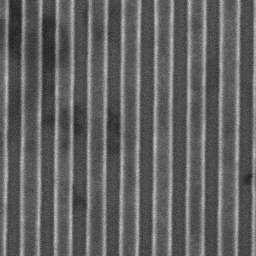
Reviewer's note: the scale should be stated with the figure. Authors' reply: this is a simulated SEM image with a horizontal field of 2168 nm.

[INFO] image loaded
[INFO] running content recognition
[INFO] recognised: wiring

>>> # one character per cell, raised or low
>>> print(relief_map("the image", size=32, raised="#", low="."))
#..##..##..##..###.###..##..##..
#..##..##..##..###.###..##..##..
#..##..##..##..##..###..##..##..
#..##..##..##..##..###..##..##..
#..##..##..##..##..###..##..##..
#..##..##..##..##..###..##..##..
#..##..##..##..##..###..##..##..
#..##..##..##..##..###..##..##..
#..##..##..##..##..###..##..##..
#..##..##..##..##..###..##..##..
#..##..##..##..##..##...##..##..
#..##..##..##..##..##...##..##..
#..##..##..##..##..##...##.###..
#..##..##..##..##..##...##.###..
#..##..##..##..##..##..###.###..
#..##..##..##..##..##..###.###..
#..##..##..##..##..##..###.###..
#..##..##..##..##..##..###.###..
#..##..##..##..##..##..##..###..
#..##..##..##..##..##..##..###..
#..##..##..##..##..##..##..###..
#..##..##..##..##..##..##..###..
#..##..##..##..##..##..##..###..
#..##..##..##..##..##..##..###..
#..##..##..##..##..##..##..###..
#..##..##..##..##..##..##..###..
#..##..##..##..##..##..##..###..
#..##..##..##..##..##..##..###..
#..##..##..##..##..##..##..###..
#..##..##..##..##..##..##..###..
#..##..##..##..##..##..##..###..
#..##..##..##..##..##..##..###..